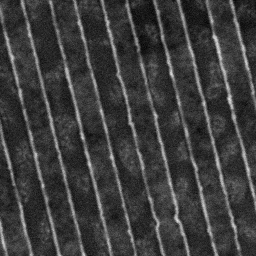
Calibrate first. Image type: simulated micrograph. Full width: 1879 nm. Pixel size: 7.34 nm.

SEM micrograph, parallel lines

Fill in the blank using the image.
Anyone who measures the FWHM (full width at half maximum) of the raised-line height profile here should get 190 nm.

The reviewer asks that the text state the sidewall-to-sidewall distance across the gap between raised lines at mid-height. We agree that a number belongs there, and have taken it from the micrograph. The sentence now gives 0.185 um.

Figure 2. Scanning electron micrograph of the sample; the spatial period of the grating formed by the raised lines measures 0.373 micrometres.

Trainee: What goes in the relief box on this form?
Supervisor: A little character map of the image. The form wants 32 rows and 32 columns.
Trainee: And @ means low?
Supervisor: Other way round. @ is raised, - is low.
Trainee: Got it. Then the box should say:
@@@---@@@@---@@@---@@@@---@@@---
@@@----@@@---@@@----@@@---@@@---
@@@----@@@---@@@----@@@---@@@@--
@@@@---@@@---@@@@---@@@----@@@--
-@@@---@@@----@@@---@@@----@@@--
-@@@---@@@@---@@@---@@@@---@@@--
-@@@----@@@---@@@----@@@---@@@@-
-@@@@---@@@---@@@@---@@@---@@@@-
--@@@---@@@----@@@---@@@@---@@@-
--@@@---@@@@---@@@---@@@@---@@@-
--@@@----@@@---@@@----@@@---@@@@
--@@@@---@@@---@@@@---@@@----@@@
---@@@---@@@----@@@---@@@@---@@@
---@@@---@@@@---@@@---@@@@---@@@
---@@@----@@@---@@@@---@@@---@@@
---@@@@---@@@---@@@@---@@@---@@@
----@@@---@@@----@@@---@@@----@@
----@@@---@@@@---@@@---@@@@---@@
@---@@@----@@@---@@@----@@@---@@
@---@@@@---@@@---@@@@---@@@---@@
@----@@@---@@@----@@@---@@@----@
@@---@@@---@@@@---@@@---@@@@---@
@@---@@@----@@@---@@@----@@@---@
@@---@@@@---@@@---@@@@---@@@---@
@@----@@@---@@@---@@@@---@@@----
@@@---@@@---@@@@---@@@---@@@@---
@@@---@@@----@@@---@@@---@@@@---
@@@---@@@----@@@---@@@----@@@---
@@@----@@@---@@@----@@@---@@@@--
@@@----@@@---@@@----@@@---@@@@--
@@@@---@@@----@@@---@@@----@@@--
-@@@---@@@----@@@---@@@@---@@@--